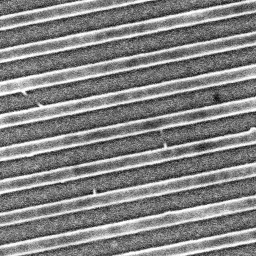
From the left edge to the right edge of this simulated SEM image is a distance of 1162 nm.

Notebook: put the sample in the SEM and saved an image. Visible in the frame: parallel lines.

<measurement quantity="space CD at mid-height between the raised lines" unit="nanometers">94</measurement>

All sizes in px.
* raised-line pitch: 32.1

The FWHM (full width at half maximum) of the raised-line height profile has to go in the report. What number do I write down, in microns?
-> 0.0514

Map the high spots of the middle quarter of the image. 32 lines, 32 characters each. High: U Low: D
DDDDDDUUUUUUUUUUUUUUDDDDDDDDDDDD
DUUUUUUUUUUUUUUDDDDDDDDDDDDDDDDD
UUUUUUUUUUDDDDDDDDDDDDDDDDDDDDDD
UUUUUDDDDDDDDDDDDDDDDDDDDDDDDDDD
DDDDDDDDDDDDDDDDDDDDDDDDDDDUUUUU
DDDDDDDDDDDDDDDDDDDDDDUUUUUUUUUU
DDDDDDDDDDDDDDDDDUUUUUUUUUUUUUUD
DDDDDDDDDDDDUUUUUUUUUUUUUUDDDDDD
DDDDDDDUUUUUUUUUUUUUUDDDDDDDDDDD
DDUUUUUUUUUUUUUUDDDDDDDDDDDDDDDD
UUUUUUUUUUUDDDDDDDDDDDDDDDDDDDDD
UUUUUUDDDDDDDDDDDDDDDDDDDDDDDDDD
UDDDDDDDDDDDDDDDDDDDDDDDDDDDUUUU
DDDDDDDDDDDDDDDDDDDDDDDUUUUUUUUU
DDDDDDDDDDDDDDDDDDUUUUUUUUUUUUUU
DDDDDDDDDDDDDUUUUUUUUUUUUUUDDDDD
DDDDDDDDUUUUUUUUUUUUUUDDDDDDDDDD
DDDUUUUUUUUUUUUUUDDDDDDDDDDDDDDD
UUUUUUUUUUUUDDDDDDDDDDDDDDDDDDDD
UUUUUUUDDDDDDDDDDDDDDDDDDDDDDDDD
UUDDDDDDDDDDDDDDDDDDDDDDDDDDDUUU
DDDDDDDDDDDDDDDDDDDDDDDDUUUUUUUU
DDDDDDDDDDDDDDDDDDDUUUUUUUUUUUUU
DDDDDDDDDDDDDDUUUUUUUUUUUUUUDDDD
DDDDDDDDDUUUUUUUUUUUUUUUDDDDDDDD
DDDDUUUUUUUUUUUUUUDDDDDDDDDDDDDD
UUUUUUUUUUUUUDDDDDDDDDDDDDDDDDDD
UUUUUUUUDDDDDDDDDDDDDDDDDDDDDDDD
UUUDDDDDDDDDDDDDDDDDDDDDDDDDDDUU
DDDDDDDDDDDDDDDDDDDDDDDDDUUUUUUU
DDDDDDDDDDDDDDDDDDDDUUUUUUUUUUUU
DDDDDDDDDDDDDDDUUUUUUUUUUUUUUDDD